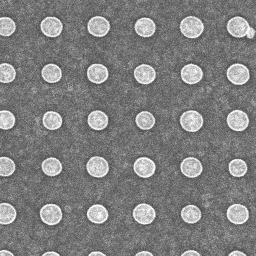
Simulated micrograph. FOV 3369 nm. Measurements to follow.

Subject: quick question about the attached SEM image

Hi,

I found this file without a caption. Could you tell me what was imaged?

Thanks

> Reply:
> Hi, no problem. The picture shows a regular array of raised bodies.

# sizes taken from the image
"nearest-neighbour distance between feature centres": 46.3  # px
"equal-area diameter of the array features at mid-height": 20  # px